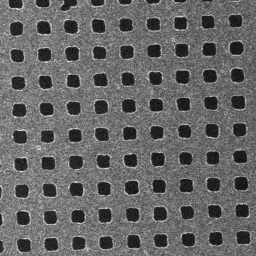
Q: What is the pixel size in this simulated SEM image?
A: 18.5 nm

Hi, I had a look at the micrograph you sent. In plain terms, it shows a regular array of holes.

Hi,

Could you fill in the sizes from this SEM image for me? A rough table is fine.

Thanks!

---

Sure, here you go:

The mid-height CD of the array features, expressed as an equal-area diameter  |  275 nanometers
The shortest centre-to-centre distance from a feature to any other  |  498 nanometres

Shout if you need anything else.